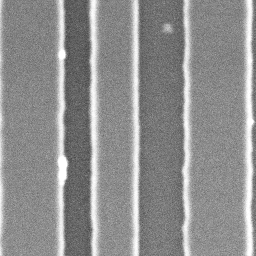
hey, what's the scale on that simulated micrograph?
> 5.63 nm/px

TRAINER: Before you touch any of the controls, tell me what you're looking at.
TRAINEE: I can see lines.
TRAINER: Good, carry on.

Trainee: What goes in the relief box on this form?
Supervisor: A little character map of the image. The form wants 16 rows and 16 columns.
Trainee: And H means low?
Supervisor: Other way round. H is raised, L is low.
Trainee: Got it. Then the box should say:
HHHHLLHHHLLLHHHH
HHHHLLHHHLLLHHHH
HHHHLLHHHLLLHHHH
HHHHLLHHHLLLHHHH
HHHHLLHHHLLLHHHH
HHHHLLHHHLLLHHHH
HHHHLLHHHLLLHHHH
HHHHLLHHHLLLHHHH
HHHHLLHHHLLLHHHH
HHHHLLHHHLLLHHHH
HHHHLLHHHLLLHHHH
HHHHLLHHHLLLHHHH
HHHHLLHHHLLLHHHH
HHHHLLHHHLLLHHHH
HHHHLLHHHLLLHHHH
HHHHLLHHHLLLHHHH